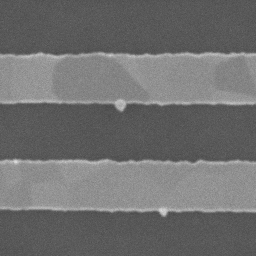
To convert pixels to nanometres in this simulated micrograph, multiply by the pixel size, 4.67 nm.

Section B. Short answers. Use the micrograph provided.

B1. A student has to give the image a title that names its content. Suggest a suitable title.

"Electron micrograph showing lines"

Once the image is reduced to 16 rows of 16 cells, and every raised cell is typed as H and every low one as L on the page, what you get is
LLLLLLLLLLLLLLLL
LLLLLLLLLLLLLLLL
LLLLLLLLLLLLLLLL
HHHHHHHHHHHHHHHH
HHHHHHHHHHHHHHHH
HHHHHHHHHHHHHHHH
LLLLLLLHLLHLLLLL
LLLLLLLLLLLLLLLL
LLLLLLLLLLLLLLLL
LLLLLLLLLLLLLLLL
HHHHHHHHHHHHHHHH
HHHHHHHHHHHHHHHH
HHHHHHHHHHHHHHHH
LLLLLLLLLLLLLLLL
LLLLLLLLLLLLLLLL
LLLLLLLLLLLLLLLL